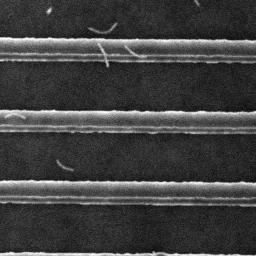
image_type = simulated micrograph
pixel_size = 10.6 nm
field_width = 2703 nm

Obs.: lines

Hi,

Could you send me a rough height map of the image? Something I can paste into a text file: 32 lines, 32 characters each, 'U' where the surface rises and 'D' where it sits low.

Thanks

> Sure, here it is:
DDDDDDDDDDDDDDDDDDDDDDDDDDDDDDDD
DDDDDDDDDDDDDDDDDDDDDDDDDDDDDDDD
DDDDDDDDDDDDDDDDDDDDDDDDDDDDDDDD
DDDDDDDDDDDDDDDDDDDDDDDDDDDDDDDD
DDDDDDDDDDDDDDDDDDDDDDDDDDDDDDDD
UUUUUUUUUUUUUUUUUUUUUUUUUUUUUUUU
UUUUUUUUUUUUUUUUUUUUUUUUUUUUUUUU
DDUUUUUUUUUUUUUUUUUUUUUUUUUUUUUU
DDDDDDDDDDDDDDDDDDDDDDDDDDDDDDDD
DDDDDDDDDDDDDDDDDDDDDDDDDDDDDDDD
DDDDDDDDDDDDDDDDDDDDDDDDDDDDDDDD
DDDDDDDDDDDDDDDDDDDDDDDDDDDDDDDD
DDDDDDDDDDDDDDDDDDDDDDDDDDDDDDDD
DDDDDDDDDDDDDDDDDDDDDDDDDDDDDDDD
UUUUUUUUUUUUUUUUUUUUUUUUUUUUUUUU
UUUUUUUUUUUUUUUUUUUUUUUUUUUUUUUU
DDDDDDDDDDUUDUUUUUUUUUUUUUUUUUUU
DDDDDDDDDDDDDDDDDDDDDDDDDDDDDDDD
DDDDDDDDDDDDDDDDDDDDDDDDDDDDDDDD
DDDDDDDDDDDDDDDDDDDDDDDDDDDDDDDD
DDDDDDDDDDDDDDDDDDDDDDDDDDDDDDDD
DDDDDDDDDDDDDDDDDDDDDDDDDDDDDDDD
DDDDDDDDDDDDDDDDDDDDDDDDDDDDDDDD
UUUUUUUUUUUUUUUUUUUUUUUUUUUUUUUU
UUUUUUUUUUUUUUUUUUUUUUUUUUUUUUUU
DDDDDDDDDDDDDDDDDDDUUUUUUUUUUUUU
DDDDDDDDDDDDDDDDDDDDDDDDDDDDDDDD
DDDDDDDDDDDDDDDDDDDDDDDDDDDDDDDD
DDDDDDDDDDDDDDDDDDDDDDDDDDDDDDDD
DDDDDDDDDDDDDDDDDDDDDDDDDDDDDDDD
DDDDDDDDDDDDDDDDDDDDDDDDDDDDDDDD
DDDDDDDDDDDDDDDDDDDDDDDDDDDDDDDD